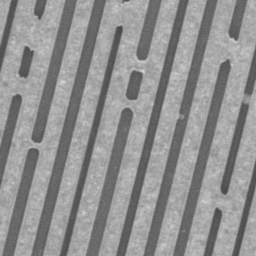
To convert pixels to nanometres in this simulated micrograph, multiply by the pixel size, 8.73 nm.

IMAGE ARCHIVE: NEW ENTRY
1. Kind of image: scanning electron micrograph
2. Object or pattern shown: parallel lines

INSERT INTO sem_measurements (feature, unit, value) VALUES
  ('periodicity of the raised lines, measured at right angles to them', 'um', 0.243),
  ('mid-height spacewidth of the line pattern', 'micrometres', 0.104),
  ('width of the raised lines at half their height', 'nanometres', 145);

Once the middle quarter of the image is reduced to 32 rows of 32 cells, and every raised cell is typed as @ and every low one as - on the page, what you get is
@@@----@@@@--@@@@@@@@@@@@--@@@@-
@@@---@@@@--@@@@@-@@@@@@---@@@@-
@@@---@@@@--@@@@@---@@@@---@@@@-
@@@---@@@@--@@@@----@@@@---@@@@-
@@----@@@@--@@@@---@@@@@--@@@@--
@@---@@@@--@@@@@---@@@@---@@@@--
@@---@@@@--@@@@@---@@@@---@@@@--
@@---@@@@--@@@@----@@@@---@@@@--
@----@@@@--@@@@@--@@@@@--@@@@---
@---@@@@--@@@@@@@@@@@@---@@@@---
@---@@@@--@@@@@@@@@@@@---@@@@---
@---@@@@--@@@@---@@@@@---@@@@---
----@@@@--@@@@----@@@@--@@@@----
---@@@@--@@@@@---@@@@---@@@@---@
---@@@@--@@@@----@@@@---@@@@---@
---@@@@--@@@@----@@@@---@@@@---@
---@@@@--@@@@----@@@@--@@@@----@
--@@@@--@@@@@---@@@@---@@@@---@@
--@@@@--@@@@----@@@@---@@@@---@@
--@@@@--@@@@----@@@@---@@@@---@@
--@@@@--@@@@----@@@@--@@@@----@@
-@@@@--@@@@@---@@@@---@@@@---@@@
-@@@@--@@@@----@@@@---@@@@---@@@
-@@@@--@@@@----@@@@---@@@@---@@@
-@@@@--@@@@----@@@@--@@@@----@@@
@@@@--@@@@@---@@@@---@@@@---@@@@
@@@@--@@@@@---@@@@---@@@@---@@@@
@@@@--@@@@----@@@@---@@@@---@@@@
@@@@--@@@@----@@@@--@@@@----@@@@
@@@--@@@@@---@@@@---@@@@---@@@@@
@@@--@@@@----@@@@---@@@@---@@@@-
@@@--@@@@----@@@@---@@@@---@@@@-